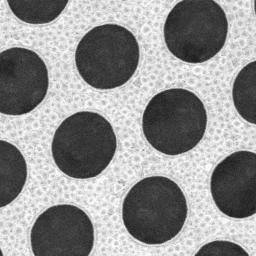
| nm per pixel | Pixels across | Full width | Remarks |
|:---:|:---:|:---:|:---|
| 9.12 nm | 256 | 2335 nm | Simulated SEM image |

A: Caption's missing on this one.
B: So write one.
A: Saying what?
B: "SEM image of holes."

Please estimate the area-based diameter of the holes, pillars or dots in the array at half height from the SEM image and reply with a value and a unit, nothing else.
607 nm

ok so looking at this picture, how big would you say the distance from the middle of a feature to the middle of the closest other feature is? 832 nanometres